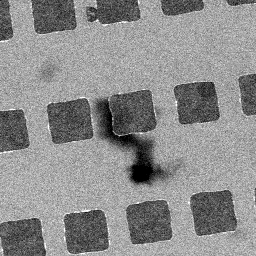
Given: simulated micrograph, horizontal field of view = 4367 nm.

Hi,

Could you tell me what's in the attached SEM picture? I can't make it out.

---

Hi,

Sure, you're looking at raised bodies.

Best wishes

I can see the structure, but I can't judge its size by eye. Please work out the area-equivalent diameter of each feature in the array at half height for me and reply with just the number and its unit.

814 nm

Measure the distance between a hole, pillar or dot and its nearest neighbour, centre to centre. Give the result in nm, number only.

1090